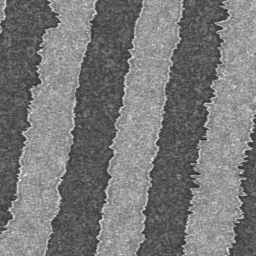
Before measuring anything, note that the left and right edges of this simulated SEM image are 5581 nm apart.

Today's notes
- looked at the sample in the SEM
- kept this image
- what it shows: one or a few lines or trenches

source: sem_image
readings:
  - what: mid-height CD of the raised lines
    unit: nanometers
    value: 917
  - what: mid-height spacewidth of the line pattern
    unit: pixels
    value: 45.9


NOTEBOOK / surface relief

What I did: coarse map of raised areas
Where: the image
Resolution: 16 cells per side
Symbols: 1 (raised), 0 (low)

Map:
0001110001100011
0000110001100011
0001110011100011
0001100011100011
0011100011100011
0011100011000111
0011100011000111
0011100111000111
0011000111000111
0111000111001110
0111000110001110
0111000110001110
0111000110001110
0110001110001110
1110001110001110
1110001110001100